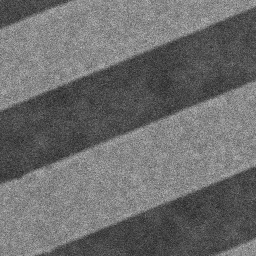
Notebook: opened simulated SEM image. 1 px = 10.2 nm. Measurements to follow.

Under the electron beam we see one or a few lines or trenches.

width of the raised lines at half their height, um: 0.782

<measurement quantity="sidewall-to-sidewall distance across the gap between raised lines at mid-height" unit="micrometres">0.725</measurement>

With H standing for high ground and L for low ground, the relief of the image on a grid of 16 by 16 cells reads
LLLLHHHHHHHHHHHH
LHHHHHHHHHHHHLLL
HHHHHHHHHHHLLLLL
HHHHHHHHLLLLLLLL
HHHHHHLLLLLLLLLL
HHHLLLLLLLLLLLLH
HLLLLLLLLLLLLHHH
LLLLLLLLLLHHHHHH
LLLLLLLLHHHHHHHH
LLLLLHHHHHHHHHHH
LLLHHHHHHHHHHHHL
HHHHHHHHHHHHHLLL
HHHHHHHHHHHLLLLL
HHHHHHHHLLLLLLLL
HHHHHHLLLLLLLLLL
HHHLLLLLLLLLLLLH